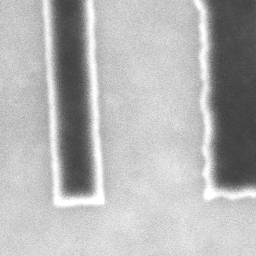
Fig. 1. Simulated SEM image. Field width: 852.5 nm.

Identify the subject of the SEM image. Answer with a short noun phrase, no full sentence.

one or a few lines or trenches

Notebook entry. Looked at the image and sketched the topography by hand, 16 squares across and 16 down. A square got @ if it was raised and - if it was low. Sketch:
---@@@------@@@@
---@@@-------@@@
---@@@-------@@@
---@@@-------@@@
---@@@-------@@@
---@@@-------@@@
---@@@-------@@@
---@@@-------@@@
---@@@-------@@@
---@@@-------@@@
---@@@-------@@@
---@@@-------@@@
----@@----------
----------------
----------------
----------------